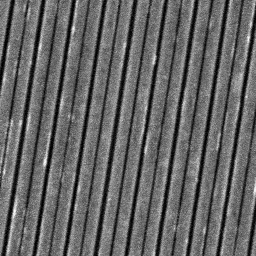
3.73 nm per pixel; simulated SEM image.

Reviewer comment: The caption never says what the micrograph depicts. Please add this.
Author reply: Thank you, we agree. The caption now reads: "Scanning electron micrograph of parallel lines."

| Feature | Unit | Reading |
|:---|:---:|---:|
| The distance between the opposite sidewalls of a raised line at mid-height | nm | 45.1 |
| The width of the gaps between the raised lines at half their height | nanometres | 14.2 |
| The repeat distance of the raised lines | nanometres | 56.3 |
